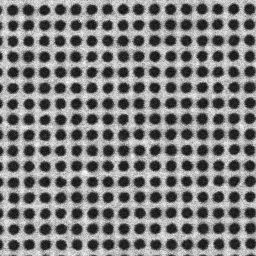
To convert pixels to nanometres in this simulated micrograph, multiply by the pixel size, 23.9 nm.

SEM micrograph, a regular array of holes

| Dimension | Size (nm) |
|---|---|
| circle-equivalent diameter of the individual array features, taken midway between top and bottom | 286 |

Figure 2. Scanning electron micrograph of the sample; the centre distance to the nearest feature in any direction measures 371 nanometres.